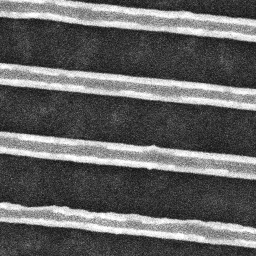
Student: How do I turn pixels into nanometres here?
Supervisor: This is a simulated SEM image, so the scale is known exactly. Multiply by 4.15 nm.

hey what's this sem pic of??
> one or a few lines or trenches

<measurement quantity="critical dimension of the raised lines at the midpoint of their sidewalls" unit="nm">75.3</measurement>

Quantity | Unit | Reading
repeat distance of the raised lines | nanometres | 284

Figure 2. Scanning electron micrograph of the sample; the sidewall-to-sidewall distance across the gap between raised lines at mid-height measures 209 nanometers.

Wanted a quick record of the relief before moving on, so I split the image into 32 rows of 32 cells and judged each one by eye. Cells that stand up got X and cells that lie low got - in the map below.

XXXXXXXXXX----------------------
XXXXXXXXXXXXXXXXXXXX------------
--------XXXXXXXXXXXXXXXXXXXXXX--
-------------------XXXXXXXXXXXXX
-----------------------------XXX
--------------------------------
--------------------------------
--------------------------------
XXX-----------------------------
XXXXXXXXXXXXXX------------------
---XXXXXXXXXXXXXXXXXXXXX--------
------------XXXXXXXXXXXXXXXXXXXX
----------------------XXXXXXXXXX
-------------------------------X
--------------------------------
--------------------------------
--------------------------------
XXXXXXXX------------------------
XXXXXXXXXXXXXXXXXX-X------------
-----XXXXXXXXXXXXXXXXXXXXXXX----
---------------XXXXXXXXXXXXXXXXX
--------------------------XXXXXX
--------------------------------
--------------------------------
--------------------------------
--------------------------------
XXXXXXXXXX----------------------
XXXXXXXXXXXXXXXXXXX-XX----------
-----------XXXXXXXXXXXXXXXXXXX--
--------------------XXXXXXXXXXXX
------------------------------XX
--------------------------------